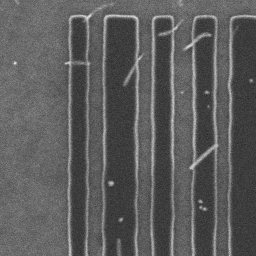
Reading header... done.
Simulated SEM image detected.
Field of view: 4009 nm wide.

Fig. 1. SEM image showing groups of lines, slits or small figures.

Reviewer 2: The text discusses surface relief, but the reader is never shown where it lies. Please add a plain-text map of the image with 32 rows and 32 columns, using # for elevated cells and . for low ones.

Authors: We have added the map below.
................................
................................
.........##..####..###..###..###
.........##..####..###..###..###
.........##..####..###..###..###
.........##..####..###..###..###
.........##..####..###..###..###
.........##..####..###..###..###
.........##..####..###..###..###
.........##..####..###..###..###
.........##..####..###..###..###
.........##..####..###..###..###
.........##..####..###..###..###
.........##..####..###..###..###
.........##..####..###..###..###
.........##..####..###..###..###
.........##..####..###..###..###
.........##..####..###..###..###
.........##..####..###..###..###
.........##..####..###..###..###
.........##..####..###..###..###
.........##..####..###..###..###
.........##..####..###..###..###
.........##..####..###..###..###
.........##..####..###..###..###
.........##..####..###..###..###
.........##..####..###..###..###
.........##..####..###..###..###
.........##..####..###..###..###
.........##..####..###..###..###
.........##..####..###..###..###
.........##..####..###..###..###